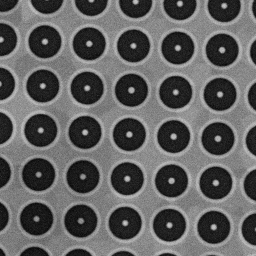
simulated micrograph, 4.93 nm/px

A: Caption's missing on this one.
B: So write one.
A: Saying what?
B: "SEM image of an array of small figures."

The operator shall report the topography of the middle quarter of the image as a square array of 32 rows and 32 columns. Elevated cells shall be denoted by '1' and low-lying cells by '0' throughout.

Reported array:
11111111111111111111111111110111
11111011111111111111111111111111
11100000111111100011111111111111
11000000011111000000111110000001
11000000001110000000011100000000
10000000001110000000011100000000
10000000001100001000011100000000
11000000001100000000011000000000
11000000011110000000011100000000
11100000011111000000111100000000
11111011111111100001111110000001
11111111111111111111111111100111
11111011111111111111111111111111
11100000111111100011111111111111
11000000011110000001111110000011
10000000011100000000111100000001
10000000001100000000011000000001
10000000001100001000011000000000
10000000011100000000011000010000
11000000011100000000111000000000
11000000111110000000111100000001
11110011111111000011111100000011
11111111111111111111111111001111
11111111111111111111111111111111
11000001111111000111111111111111
10000000111110000001111110000111
10000000011100000000111100000011
00000000011000000000111000000001
00001000011000000000110000000001
10000000011000000000110000100000
10000000011100000000111000000001
11000000111100000001111000000001